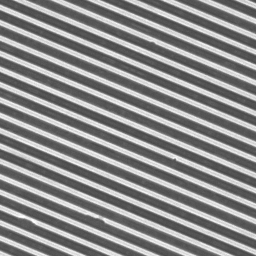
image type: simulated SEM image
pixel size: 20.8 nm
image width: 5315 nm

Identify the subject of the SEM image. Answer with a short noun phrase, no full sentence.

parallel lines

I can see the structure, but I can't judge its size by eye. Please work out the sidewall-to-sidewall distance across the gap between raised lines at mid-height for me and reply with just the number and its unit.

187 nanometers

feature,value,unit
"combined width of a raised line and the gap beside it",295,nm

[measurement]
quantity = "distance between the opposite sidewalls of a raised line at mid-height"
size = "113 nanometers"